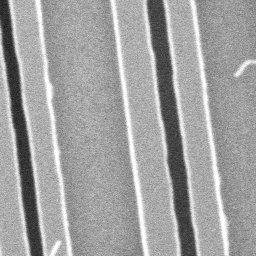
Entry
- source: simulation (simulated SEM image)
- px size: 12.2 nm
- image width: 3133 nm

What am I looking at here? lines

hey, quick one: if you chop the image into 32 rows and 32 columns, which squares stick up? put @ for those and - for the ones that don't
-@@@@---------@@@@---@@@--------
-@@@@---------@@@@---@@@--------
-@@@@---------@@@@---@@@@-------
--@@@---------@@@@@--@@@@-------
--@@@----------@@@@--@@@@-------
--@@@----------@@@@--@@@@-------
--@@@@---------@@@@--@@@@-------
--@@@@---------@@@@--@@@@-------
@-@@@@---------@@@@---@@@-------
@--@@@---------@@@@@--@@@-------
@--@@@---------@@@@@--@@@@------
@--@@@---------@@@@@--@@@@------
@--@@@----------@@@@--@@@@------
@--@@@----------@@@@--@@@@------
@--@@@@---------@@@@--@@@@------
@@-@@@@---------@@@@---@@@------
@@--@@@---------@@@@@--@@@------
@@--@@@---------@@@@@--@@@@-----
@@--@@@---------@@@@@--@@@@-----
@@--@@@---------@@@@@--@@@@-----
@@--@@@----------@@@@--@@@@-----
@@--@@@----------@@@@--@@@@-----
@@--@@@@---------@@@@---@@@-----
@@@-@@@@---------@@@@---@@@-----
@@@--@@@---------@@@@@--@@@-----
@@@--@@@---------@@@@@--@@@@----
@@@--@@@---------@@@@@--@@@@----
@@@--@@@----------@@@@--@@@@----
@@@--@@@----------@@@@--@@@@----
@@@--@@@@---------@@@@--@@@@----
@@@@-@@@@---------@@@@---@@@----
@@@@-@@@@---------@@@@---@@@----